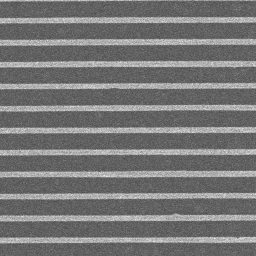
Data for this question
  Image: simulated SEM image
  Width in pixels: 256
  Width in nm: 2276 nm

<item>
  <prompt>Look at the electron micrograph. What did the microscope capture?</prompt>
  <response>parallel lines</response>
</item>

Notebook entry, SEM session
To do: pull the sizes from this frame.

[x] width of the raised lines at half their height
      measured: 0.0456 microns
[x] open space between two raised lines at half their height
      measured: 153 nanometres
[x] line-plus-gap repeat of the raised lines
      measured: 196 nm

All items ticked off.